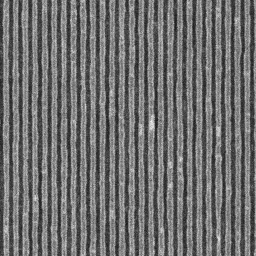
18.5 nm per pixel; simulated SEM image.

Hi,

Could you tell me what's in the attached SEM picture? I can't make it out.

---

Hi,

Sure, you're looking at parallel lines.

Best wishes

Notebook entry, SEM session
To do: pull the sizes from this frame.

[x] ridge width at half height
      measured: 85.7 nanometres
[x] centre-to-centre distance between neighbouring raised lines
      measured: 179 nanometers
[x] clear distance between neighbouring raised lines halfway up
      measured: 99.6 nanometers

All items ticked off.